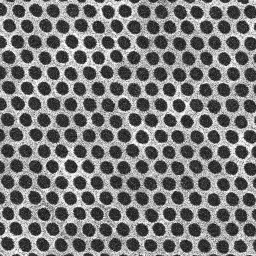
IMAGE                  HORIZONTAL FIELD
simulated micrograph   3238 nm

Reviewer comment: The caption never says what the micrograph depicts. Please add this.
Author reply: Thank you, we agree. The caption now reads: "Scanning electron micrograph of a regular array of holes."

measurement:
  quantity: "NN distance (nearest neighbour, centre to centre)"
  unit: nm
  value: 217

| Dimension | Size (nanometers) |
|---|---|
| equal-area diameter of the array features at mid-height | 172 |